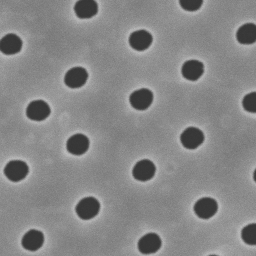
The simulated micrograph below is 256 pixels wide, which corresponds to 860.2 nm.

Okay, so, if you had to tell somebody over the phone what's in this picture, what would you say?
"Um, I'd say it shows a regular array of holes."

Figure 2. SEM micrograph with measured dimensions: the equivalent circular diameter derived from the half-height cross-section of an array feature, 0.0769 um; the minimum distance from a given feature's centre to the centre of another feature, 0.198 microns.